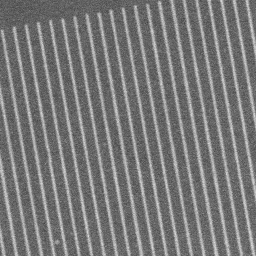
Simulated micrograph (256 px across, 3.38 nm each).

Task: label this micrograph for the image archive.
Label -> parallel lines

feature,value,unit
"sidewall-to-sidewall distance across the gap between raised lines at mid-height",0.0324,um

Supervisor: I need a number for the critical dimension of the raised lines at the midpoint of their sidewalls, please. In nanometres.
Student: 7.9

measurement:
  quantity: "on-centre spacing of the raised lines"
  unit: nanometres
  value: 41.5